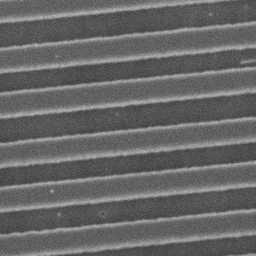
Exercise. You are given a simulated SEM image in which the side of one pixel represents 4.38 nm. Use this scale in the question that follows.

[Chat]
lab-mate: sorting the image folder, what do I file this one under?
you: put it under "lines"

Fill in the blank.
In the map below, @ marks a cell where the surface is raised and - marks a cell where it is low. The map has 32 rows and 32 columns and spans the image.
@@@@@@@@@@@@@@@@@@@@@@----------
@@@@@@@@@@@@@-------------------
@@@@----------------------------
-------------------------@@@@@@@
---------------@@@@@@@@@@@@@@@@@
-----@@@@@@@@@@@@@@@@@@@@@@@@@@@
@@@@@@@@@@@@@@@@@@@@@@@@@@------
@@@@@@@@@@@@@@@@----------------
@@@@@@------------------------@@
---------------------@@@@@@@@@@@
-----------@@@@@@@@@@@@@@@@@@@@@
-@@@@@@@@@@@@@@@@@@@@@@@@@@@@@@-
@@@@@@@@@@@@@@@@@@@@@@----------
@@@@@@@@@@@@--------------------
@@@-----------------------------
-----------------------@@@@@@@@@
-------------@@@@@@@@@@@@@@@@@@@
----@@@@@@@@@@@@@@@@@@@@@@@@@@@@
@@@@@@@@@@@@@@@@@@@@@@@@--------
@@@@@@@@@@@@@@------------------
@@@@------------------------@@@@
--------------------@@@@@@@@@@@@
---------@@@@@@@@@@@@@@@@@@@@@@@
@@@@@@@@@@@@@@@@@@@@@@@@@@@@@---
@@@@@@@@@@@@@@@@@@@-------------
@@@@@@@@@-----------------------
----------------------------@@@@
-------------------@@@@@@@@@@@@@
---------@@@@@@@@@@@@@@@@@@@@@@@
@@@@@@@@@@@@@@@@@@@@@@@@@@@@@---
@@@@@@@@@@@@@@@@@@@-------------
@@@@@@@@@@----------------------